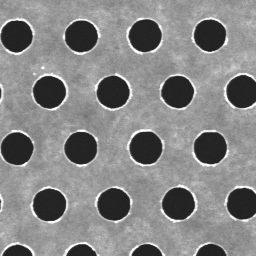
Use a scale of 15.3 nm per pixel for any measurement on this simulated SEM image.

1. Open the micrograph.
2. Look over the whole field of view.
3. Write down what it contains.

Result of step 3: a regular array of holes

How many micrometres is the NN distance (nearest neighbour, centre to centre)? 0.982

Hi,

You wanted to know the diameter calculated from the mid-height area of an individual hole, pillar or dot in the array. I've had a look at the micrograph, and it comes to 507 nanometres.